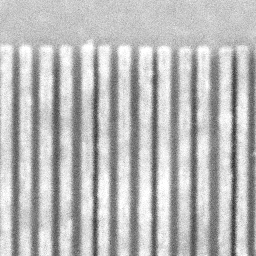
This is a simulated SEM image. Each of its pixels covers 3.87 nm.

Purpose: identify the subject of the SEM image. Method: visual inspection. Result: parallel lines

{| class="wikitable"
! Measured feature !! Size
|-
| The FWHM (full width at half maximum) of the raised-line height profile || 41.6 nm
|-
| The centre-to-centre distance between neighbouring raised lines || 76.2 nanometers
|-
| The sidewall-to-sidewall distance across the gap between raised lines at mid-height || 35.3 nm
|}